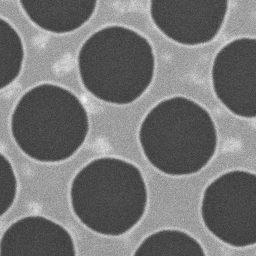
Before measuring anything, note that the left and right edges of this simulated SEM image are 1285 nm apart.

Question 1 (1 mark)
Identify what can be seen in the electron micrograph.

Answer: holes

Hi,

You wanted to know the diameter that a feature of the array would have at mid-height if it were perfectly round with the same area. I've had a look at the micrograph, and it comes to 390 nm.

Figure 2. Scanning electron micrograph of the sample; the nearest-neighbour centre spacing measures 452 nanometers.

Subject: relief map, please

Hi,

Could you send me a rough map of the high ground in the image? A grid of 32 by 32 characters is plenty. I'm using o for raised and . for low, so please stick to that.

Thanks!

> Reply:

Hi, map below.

ooo.........ooooooo..........ooo
ooo.........ooooooo.........oooo
.ooo.......oooooooo.........oooo
..ooo.....ooo...oooo........oooo
..ooooooooo.......ooo......ooooo
...ooooooo.........oooo..ooo....
...ooooooo.........oooooooo.....
...ooooooo.........oooooooo.....
...ooooooo.........oooooooo.....
..oooooooo.........ooooooo......
.oooo.oooo.........oooooooo.....
ooo......oo.......ooooooooo.....
oo........ooo....oooo...ooo.....
oo.........oooooooo......ooo....
o..........ooooooo........oooo..
o..........ooooooo.........ooooo
o..........oooooo..........ooooo
oo.........oooooo..........ooooo
oo........oooooooo.........ooooo
.ooo.....ooooooooo.........ooooo
.oooooooooo......oo.......oooooo
..oooooooo........oo.....oooo..o
..ooooooo.........ooooooooo.....
..ooooooo.........oooooooo......
..ooooooo.........ooooooo.......
..ooooooo.........ooooooo.......
.oooooooo.........ooooooo.......
oo....oooo.......oooooooo.......
o.......ooo......ooooooooo......
.........ooooo.oooo.....ooo.....
.........ooooooooo.......ooo....
.........oooooooo.........oooooo